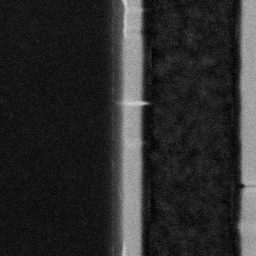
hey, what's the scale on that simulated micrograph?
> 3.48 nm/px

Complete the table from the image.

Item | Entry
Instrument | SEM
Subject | one or a few lines or trenches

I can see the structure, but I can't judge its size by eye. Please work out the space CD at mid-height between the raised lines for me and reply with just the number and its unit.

0.414 µm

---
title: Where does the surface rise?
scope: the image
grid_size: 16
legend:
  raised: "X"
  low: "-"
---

XXXXXXXX--------
XXXXXXXX--------
XXXXXXXX--------
XXXXXXXX--------
XXXXXXXX--------
XXXXXXXX--------
XXXXXXXX--------
XXXXXXXX--------
XXXXXXXX--------
XXXXXXXX--------
XXXXXXXX--------
XXXXXXXX--------
XXXXXXXX--------
XXXXXXXX--------
XXXXXXXX--------
XXXXXXXX--------